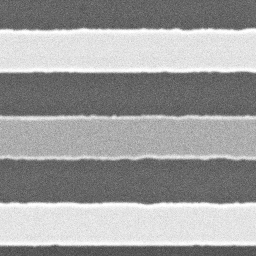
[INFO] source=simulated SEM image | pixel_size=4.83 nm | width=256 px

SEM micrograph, lines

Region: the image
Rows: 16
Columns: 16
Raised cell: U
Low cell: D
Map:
DDDDDDDDDDDDDDDD
DDDDDDDDDDDDDDDD
UUUUUUUUUUUUUUUU
UUUUUUUUUUUUUUUU
DDDDDDDDDDDDDDDD
DDDDDDDDDDDDDDDD
DDDDDDDDDDDDDDDD
UUUUUUUUUUUUUUUU
UUUUUUUUUUUUUUUU
UUUUUUUUUUUUUUUU
DDDDDDDDDDDDDDDD
DDDDDDDDDDDDDDDD
DDDDDDDDDDDDDDDD
UUUUUUUUUUUUUUUU
UUUUUUUUUUUUUUUU
DDDDDDDDDDDDDDDD